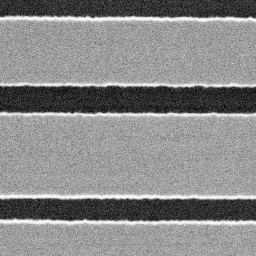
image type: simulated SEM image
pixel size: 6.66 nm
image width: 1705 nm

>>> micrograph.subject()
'lines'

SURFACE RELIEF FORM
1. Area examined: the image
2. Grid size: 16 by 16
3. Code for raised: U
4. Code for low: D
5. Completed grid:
DDDDDDDDDDDDDDDD
UUUUUUUUUUUUUUUU
UUUUUUUUUUUUUUUU
UUUUUUUUUUUUUUUU
UUUUUUUUUUUUUUUU
DDDDDDDDDDDDDDDD
DDDDDDDDDDDDDDDD
UUUUUUUUUUUUUUUU
UUUUUUUUUUUUUUUU
UUUUUUUUUUUUUUUU
UUUUUUUUUUUUUUUU
UUUUUUUUUUUUUUUU
DDDDDDDDDDDDDDDD
DDDDDDDDDDDDDDDD
UUUUUUUUUUUUUUUU
UUUUUUUUUUUUUUUU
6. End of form